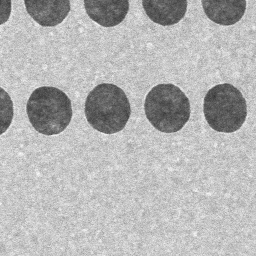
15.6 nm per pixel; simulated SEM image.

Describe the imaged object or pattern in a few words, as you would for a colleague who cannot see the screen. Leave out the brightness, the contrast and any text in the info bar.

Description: holes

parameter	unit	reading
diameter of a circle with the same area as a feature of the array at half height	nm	752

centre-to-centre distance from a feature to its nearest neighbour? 903 nanometres